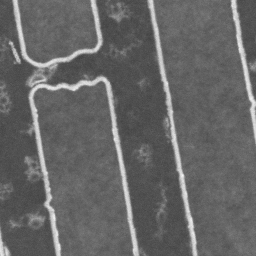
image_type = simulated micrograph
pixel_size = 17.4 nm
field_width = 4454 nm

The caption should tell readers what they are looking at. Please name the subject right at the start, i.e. one or a few lines or trenches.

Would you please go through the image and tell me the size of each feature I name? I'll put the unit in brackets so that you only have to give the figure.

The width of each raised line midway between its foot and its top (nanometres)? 1000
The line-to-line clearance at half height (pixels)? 77.2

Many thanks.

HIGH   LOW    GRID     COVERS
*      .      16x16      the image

*.....****.....*
*.....****.....*
*.....****.....*
**...*****.....*
**********.....*
**.....***......
**.....****.....
**.....****.....
**.....****.....
***....****.....
***.....***.....
***.....***.....
***.....****....
***.....****....
***.....****....
****....****....